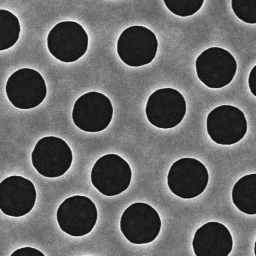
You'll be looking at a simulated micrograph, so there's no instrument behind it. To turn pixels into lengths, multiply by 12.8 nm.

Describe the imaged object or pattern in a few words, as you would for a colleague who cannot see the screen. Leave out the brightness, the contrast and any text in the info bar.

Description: a regular array of holes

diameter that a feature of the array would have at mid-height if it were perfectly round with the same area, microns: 0.528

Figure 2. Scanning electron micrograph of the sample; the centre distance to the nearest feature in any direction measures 778 nanometers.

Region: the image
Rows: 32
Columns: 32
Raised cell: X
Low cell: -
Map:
XXXXXXXXXXXXXXXXXXXXX----XXXX---
-XXXXXXXXXXXXXXXXXXXX----XXXX---
--XXXXXXXXXXXXXXXXXXXXXXXXXXXX--
---XXXX---XXXXXX--XXXXXXXXXXXXXX
--XXXX-----XXXX----XXXXXXXXXXXXX
--XXXX-----XXXX-----XXXXXXXXXXXX
XXXXXX-----XXXX-----XXXXX----XXX
XXXXXXX---XXXXX----XXXXXX----XXX
XXXXXXXXXXXXXXXXXXXXXXXX------XX
X----XXXXXXXXXXXXXXXXXXXX----XX-
X-----XXXXXXXXXXXXXXXXXXXX---XX-
X-----XXXXX-XXXXXXX---XXXXXXXXX-
X----XXXXX----XXXX-----XXXXXXXXX
XX--XXXXX-----XXXX-----XXXX---XX
XXXXXXXXX-----XXXX-----XXX-----X
XXXXXXXXX-----XXXXX---XXXX-----X
XXXXXXXXXXX-XXXXXXXXXXXXXX-----X
XXXXX---XXXXXXXXXXXXXXXXXXX---XX
XXXX-----XXXXXXXXXXXXXXXXXXXXXXX
XXXX-----XXXX--XXXXXXXXXXXXXXXXX
XXXX-----XXX----XXXXXX---XXXXXXX
XXXXX---XXX-----XXXXX-----XXXXXX
----XXXXXXX-----XXXXX-----XXXX--
----XXXXXXXX----XXXXX-----XXX---
-----XXXX--XXXXXXXXXXX---XXXX---
----XXXX----XXXXX-XXXXXXXXXXX---
----XXX-----XXX-----XXXXXXXXXX--
XXXXXXX-----XXX-----XXXXXXXXXXXX
XXXXXXXX----XXX-----XXXXX---XXXX
XXXXXXXXX-XXXXXX----XXXX-----XXX
XXXXXXXXXXXXXXXXX-XXXXXX-----XXX
XX---XXXXXXXXXXXXXXXXXXX-----XXX